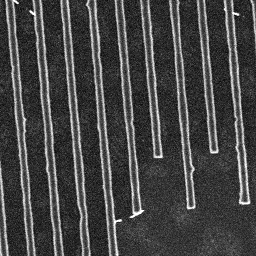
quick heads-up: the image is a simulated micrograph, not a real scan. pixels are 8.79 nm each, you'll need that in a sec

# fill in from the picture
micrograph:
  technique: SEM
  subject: parallel lines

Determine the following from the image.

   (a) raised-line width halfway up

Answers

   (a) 64.6 nm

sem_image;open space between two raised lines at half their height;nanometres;178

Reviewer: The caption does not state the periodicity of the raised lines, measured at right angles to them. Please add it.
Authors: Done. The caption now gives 240 nanometres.